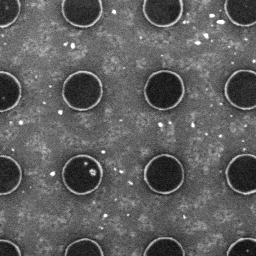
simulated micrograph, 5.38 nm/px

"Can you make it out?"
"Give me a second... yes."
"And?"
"raised bodies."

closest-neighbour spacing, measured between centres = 0.441 micrometres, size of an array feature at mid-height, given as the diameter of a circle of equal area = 209 nm